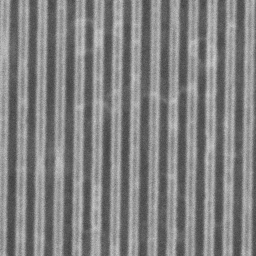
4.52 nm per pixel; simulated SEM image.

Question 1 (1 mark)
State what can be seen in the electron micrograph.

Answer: parallel lines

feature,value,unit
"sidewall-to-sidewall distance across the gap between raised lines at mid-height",51.4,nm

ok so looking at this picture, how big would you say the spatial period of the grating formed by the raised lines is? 85.3 nanometers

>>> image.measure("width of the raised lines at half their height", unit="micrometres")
0.0356